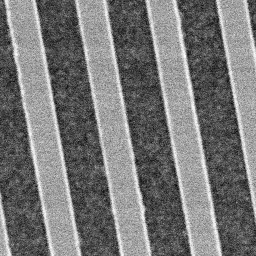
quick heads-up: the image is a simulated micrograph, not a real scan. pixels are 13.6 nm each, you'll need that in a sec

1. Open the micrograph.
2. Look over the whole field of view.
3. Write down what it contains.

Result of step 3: one or a few lines or trenches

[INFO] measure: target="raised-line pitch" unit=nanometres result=937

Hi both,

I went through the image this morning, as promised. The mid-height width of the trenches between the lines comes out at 561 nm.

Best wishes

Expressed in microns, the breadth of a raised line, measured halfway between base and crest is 0.374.